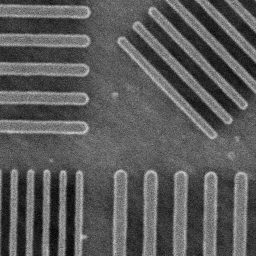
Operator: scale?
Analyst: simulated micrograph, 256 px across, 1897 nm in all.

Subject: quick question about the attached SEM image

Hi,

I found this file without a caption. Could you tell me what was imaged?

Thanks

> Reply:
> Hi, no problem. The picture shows groups of lines, slits or small figures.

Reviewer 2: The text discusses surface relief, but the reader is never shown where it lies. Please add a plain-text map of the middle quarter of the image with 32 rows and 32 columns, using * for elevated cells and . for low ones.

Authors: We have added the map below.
******.............***.....***..
******..............***.....***.
******...............***....****
......................***....***
.......................***....**
........................***....*
.........................***....
*****.....................***...
******.....................***..
******......................***.
.............................***
..............................**
...............................*
................................
................................
******..........................
******..........................
................................
................................
................................
................................
................................
................................
................................
................................
................................
................................
...*.........***....***.....***.
...*.........***....***.....***.
...**........***....***.....***.
...**........***....***.....***.
...**........***....***.....***.